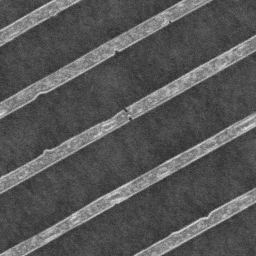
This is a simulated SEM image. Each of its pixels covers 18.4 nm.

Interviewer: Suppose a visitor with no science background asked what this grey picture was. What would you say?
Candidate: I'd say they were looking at one or a few lines or trenches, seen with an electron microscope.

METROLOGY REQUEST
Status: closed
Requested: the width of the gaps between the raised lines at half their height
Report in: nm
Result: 984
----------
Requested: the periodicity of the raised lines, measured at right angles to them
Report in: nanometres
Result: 1210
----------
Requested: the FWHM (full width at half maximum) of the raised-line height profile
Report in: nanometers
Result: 237